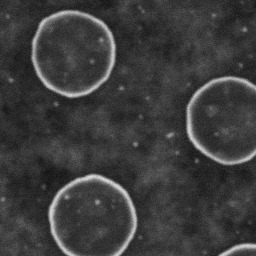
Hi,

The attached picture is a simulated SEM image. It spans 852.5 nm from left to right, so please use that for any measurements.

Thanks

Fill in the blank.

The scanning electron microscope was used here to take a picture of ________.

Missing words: raised bodies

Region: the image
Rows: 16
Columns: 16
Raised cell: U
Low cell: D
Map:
DDDDDDDDDDDDDDDD
DDDUUUDDDDDDDDDD
DDUUUUUDDDDDDDDD
DDUUUUUDDDDDDDDD
DDUUUUUDDDDDDDDD
DDDUUUDDDDDDDUUU
DDDDDDDDDDDDUUUU
DDDDDDDDDDDDUUUU
DDDDDDDDDDDDUUUU
DDDDDDDDDDDDDUUU
DDDDDDDDDDDDDDDD
DDDDUUUDDDDDDDDD
DDDUUUUUDDDDDDDD
DDDUUUUUDDDDDDDD
DDDUUUUUDDDDDDDD
DDDDUUUUDDDDDDDU